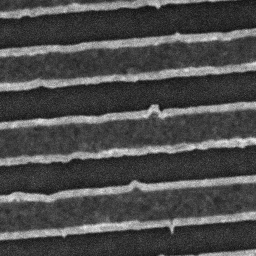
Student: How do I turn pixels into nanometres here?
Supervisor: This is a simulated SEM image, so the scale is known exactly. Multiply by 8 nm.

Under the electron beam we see one or a few lines or trenches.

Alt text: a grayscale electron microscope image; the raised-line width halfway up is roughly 299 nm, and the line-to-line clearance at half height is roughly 293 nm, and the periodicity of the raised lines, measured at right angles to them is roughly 73.6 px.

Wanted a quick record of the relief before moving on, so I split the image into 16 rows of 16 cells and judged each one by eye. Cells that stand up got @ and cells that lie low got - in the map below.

@@@@@-----------
----------------
----------@@@@@@
@@@@@@@@@@@@@@@@
@@@@@@@@@@@@----
----------------
----------------
----@@@@@@@@@@@@
@@@@@@@@@@@@@@@@
@@@@@@@@@-------
----------------
------------@@@@
@@@@@@@@@@@@@@@@
@@@@@@@@@@@@@@@@
@@@@------------
----------------